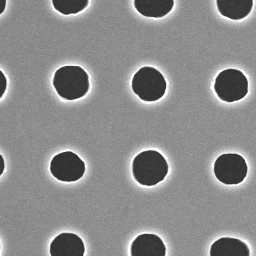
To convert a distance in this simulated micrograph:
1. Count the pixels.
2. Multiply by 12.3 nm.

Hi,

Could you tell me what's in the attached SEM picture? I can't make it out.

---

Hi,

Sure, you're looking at holes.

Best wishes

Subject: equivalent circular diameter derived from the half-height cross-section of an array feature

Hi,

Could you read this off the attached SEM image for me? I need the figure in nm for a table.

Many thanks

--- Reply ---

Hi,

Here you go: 423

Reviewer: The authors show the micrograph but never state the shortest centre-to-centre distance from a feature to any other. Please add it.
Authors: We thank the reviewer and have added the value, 999 nm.